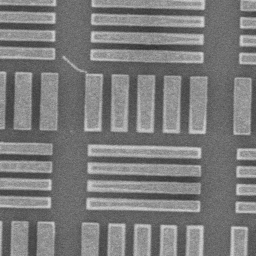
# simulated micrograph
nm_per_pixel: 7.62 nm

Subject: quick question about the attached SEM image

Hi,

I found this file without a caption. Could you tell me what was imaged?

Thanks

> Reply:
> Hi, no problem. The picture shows groups of lines, slits or small figures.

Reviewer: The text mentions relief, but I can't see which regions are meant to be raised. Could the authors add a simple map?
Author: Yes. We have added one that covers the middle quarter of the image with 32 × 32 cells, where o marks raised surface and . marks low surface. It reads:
................................
................................
................................
......oooo..oooo...ooo...oooo...
......oooo..oooo...ooo...oooo...
......ooo...oooo...ooo...oooo...
......ooo...oooo...ooo...oooo...
......ooo...oooo...ooo...oooo...
.....oooo...oooo...ooo...oooo...
.....oooo...oooo...ooo...oooo...
.....oooo...oooo...ooo...oooo...
.....oooo...oooo...ooo...oooo...
.....oooo...oooo...ooo...oooo...
.....oooo...ooo....ooo...oooo...
.....oooo...ooo....ooo...oooo...
.....oooo...ooo....ooo...oooo...
....................oo...ooo....
................................
................................
................................
................................
.......ooooooooooooooooooooooooo
.......ooooooooooooooooooooooooo
................................
................................
.......ooooooooooooooooooooo....
.......ooooooooooooooooooooooooo
.....................ooooooooooo
................................
................................
......oooooooooooooooooooooooooo
...........ooooooooooooooooooooo